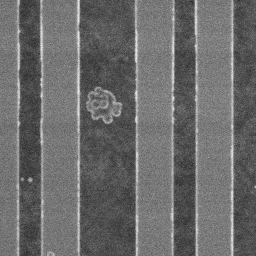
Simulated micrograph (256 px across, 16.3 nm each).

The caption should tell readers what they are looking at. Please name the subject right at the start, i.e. lines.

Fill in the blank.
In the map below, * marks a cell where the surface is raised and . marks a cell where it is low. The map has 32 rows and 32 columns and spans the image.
**...*****.......*****..*****...
**...*****.......*****..*****...
**...*****.......*****..*****...
**...*****.......*****..*****...
**...*****.......*****..*****...
**...*****.......*****..*****...
**...*****.......*****...****...
**...*****.......*****...****...
**...*****.......*****...****...
**...*****.......*****...****...
**...*****.......*****...****...
**...*****.......*****...****...
**...*****.......*****..*****...
**...*****.......*****...****...
**...*****.......*****...****...
**...*****.......*****...****...
**...*****.......*****...****...
**...*****.......*****...****...
**...*****.......*****...****...
**...*****.......*****...****...
**...*****.......*****...****...
**...*****.......*****...****...
**...*****.......*****...****...
**...*****.......*****...****...
**...*****.......*****...****...
**...*****.......*****...****...
**...*****.......*****...****...
**...*****.......*****...****...
**...*****.......*****...****...
**...*****.......*****...****...
**...*****.......*****...****...
**...*****.......*****...****...